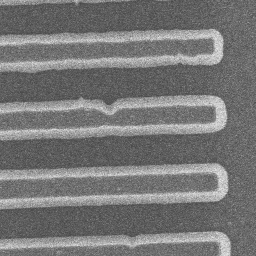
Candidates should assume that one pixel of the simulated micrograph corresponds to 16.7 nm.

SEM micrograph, one or a few lines or trenches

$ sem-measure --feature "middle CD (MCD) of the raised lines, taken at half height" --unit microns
0.493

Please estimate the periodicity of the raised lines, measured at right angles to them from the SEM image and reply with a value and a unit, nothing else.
1130 nanometers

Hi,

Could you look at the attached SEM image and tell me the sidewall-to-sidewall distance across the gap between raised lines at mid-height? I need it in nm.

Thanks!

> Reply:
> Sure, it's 643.